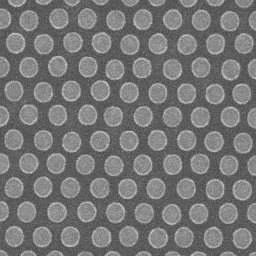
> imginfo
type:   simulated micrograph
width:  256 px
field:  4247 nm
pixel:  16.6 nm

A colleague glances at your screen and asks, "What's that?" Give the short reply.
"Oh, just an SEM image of a regular array of raised bodies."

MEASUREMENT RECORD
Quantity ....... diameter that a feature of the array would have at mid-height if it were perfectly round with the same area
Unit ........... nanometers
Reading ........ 310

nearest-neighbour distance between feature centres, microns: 0.448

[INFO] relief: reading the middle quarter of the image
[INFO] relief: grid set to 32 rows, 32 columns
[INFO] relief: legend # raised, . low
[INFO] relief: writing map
....####...####..#####...####...
....####...####..#####...####...
....####...####...###....####...
............##............##....
........##......................
####...####....###....###....###
####...####...####...#####...###
####...####...####...#####...###
###.....###...####....###....###
................#.....##......##
.....#..........................
....####...###....####....###...
#...####..####....####...####...
#...####..####....####...####...
....###...####....####...####...
............#..............#....
................................
.##....####....###....###....###
####...####...####...####....###
####...####...####...####....###
####...####...####....###....###
.##......#.....##...............
................................
....###....###....###....####...
...####....####...####...####...
...#####..#####...####...####...
....###...####....####...####...
...........###.....#............
................................
###....####...###....####....###
####...####...####...####....###
####...####...####...####...####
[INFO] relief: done